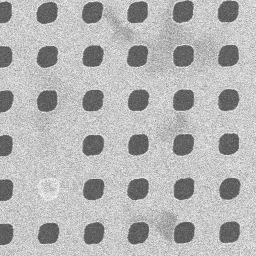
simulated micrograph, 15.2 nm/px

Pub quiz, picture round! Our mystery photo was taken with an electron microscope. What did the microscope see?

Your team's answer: a regular array of holes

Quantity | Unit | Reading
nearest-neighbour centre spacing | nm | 666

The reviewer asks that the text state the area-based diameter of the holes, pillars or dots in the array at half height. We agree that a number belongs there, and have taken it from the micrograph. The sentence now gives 0.339 um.